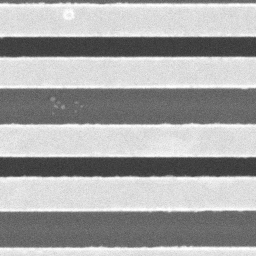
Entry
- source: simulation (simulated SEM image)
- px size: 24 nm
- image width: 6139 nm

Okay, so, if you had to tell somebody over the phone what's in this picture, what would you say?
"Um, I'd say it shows lines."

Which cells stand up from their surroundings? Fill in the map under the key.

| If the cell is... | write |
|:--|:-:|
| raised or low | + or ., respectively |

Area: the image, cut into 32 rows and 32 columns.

................................
++++++++++++++++++++++++++++++++
++++++++++++++++++++++++++++++++
++++++++++++++++++++++++++++++++
++++++++++++++++++++++++++++++++
................................
................................
++++++++++++++++++++++++++++++++
++++++++++++++++++++++++++++++++
++++++++++++++++++++++++++++++++
++++++++++++++++++++++++++++++++
................................
................................
................................
................................
................................
++++++++++++++++++++++++++++++++
++++++++++++++++++++++++++++++++
++++++++++++++++++++++++++++++++
++++++++++++++++++++++++++++++++
................................
................................
++++++++++++++++++++++++++++++++
++++++++++++++++++++++++++++++++
++++++++++++++++++++++++++++++++
++++++++++++++++++++++++++++++++
................................
................................
................................
................................
................................
++++++++++++++++++++++++++++++++